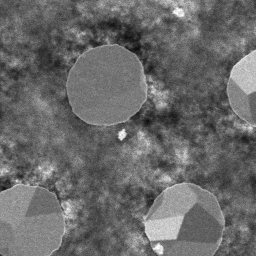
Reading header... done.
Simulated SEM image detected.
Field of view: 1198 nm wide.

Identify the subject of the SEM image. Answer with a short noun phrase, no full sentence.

raised bodies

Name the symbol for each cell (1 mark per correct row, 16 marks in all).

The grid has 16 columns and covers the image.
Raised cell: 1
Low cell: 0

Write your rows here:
0000000000000000
0000000000000000
0000000000000000
0000011100000001
0000111110000011
0000111110000011
0000111110000011
0000011100000001
0000000000000000
0000000000000000
0000000000000000
0000000000010000
1111000000111100
1111000001111100
1111000001111100
1111000000111100